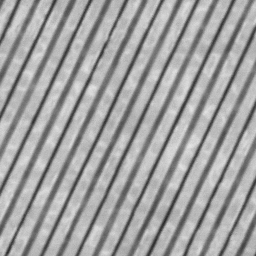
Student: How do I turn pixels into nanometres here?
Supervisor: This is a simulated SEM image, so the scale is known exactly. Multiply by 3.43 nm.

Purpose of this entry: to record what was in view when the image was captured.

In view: parallel lines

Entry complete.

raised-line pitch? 16.1 pixels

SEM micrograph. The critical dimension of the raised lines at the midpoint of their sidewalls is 38.8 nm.